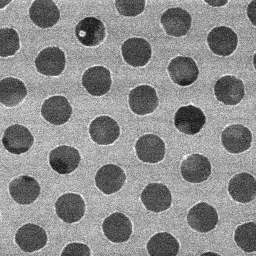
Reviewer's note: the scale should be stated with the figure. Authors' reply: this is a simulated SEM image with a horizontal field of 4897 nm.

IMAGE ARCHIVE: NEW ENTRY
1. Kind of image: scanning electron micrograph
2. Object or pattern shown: a regular array of raised bodies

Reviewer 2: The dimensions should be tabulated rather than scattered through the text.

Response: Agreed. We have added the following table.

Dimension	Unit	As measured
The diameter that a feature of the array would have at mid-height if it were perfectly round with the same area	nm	613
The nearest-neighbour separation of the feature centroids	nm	935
